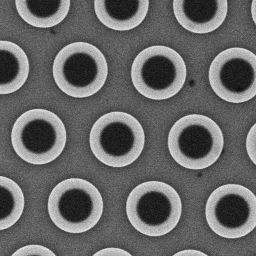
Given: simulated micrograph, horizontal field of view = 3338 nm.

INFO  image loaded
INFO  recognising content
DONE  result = an array of small figures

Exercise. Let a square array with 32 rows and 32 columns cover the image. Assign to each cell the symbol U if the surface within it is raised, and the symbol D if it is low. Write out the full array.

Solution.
DDUUUUUUUDDDUUUUUUUDDDUUUUUUDDDD
DDUUUUUUDDDDUUUUUUDDDDUUUUUUDDDU
DDDUUUUUDDDDDUUUUUDDDDUUUUUUDDDD
DDDDDDDDDDDDDDUUUDDDDDDUUUUDDDDD
DDDDDDDDDDDDDDDDDDDDDDDDDDDDDDDD
UUDDDDDDDUUDDDDDDDDDDDDDDDDDDDDD
UUUDDDDUUUUUUDDDDDUUUUDDDDDDUUUD
UUUDDDDUUUUUUDDDDUUUUUUDDDDUUUUU
UUUUDDDUUUUUUDDDUUUUUUUDDDUUUUUU
UUUDDDDUUUUUUDDDUUUUUUUDDDUUUUUU
UUUDDDDUUUUUUDDDDUUUUUUDDDUUUUUU
UUDDDDDDUUUUDDDDDUUUUUDDDDDUUUUU
DDDDDDDDDDDDDDDDDDDDDDDDDDDDUUUD
DDDDDDDDDDDDDDDDDDDDDDDDDDDDDDDD
DDDUUUUDDDDDDUUUDDDDDDDUUDDDDDDD
DDUUUUUUDDDDUUUUUDDDDDUUUUUDDDDD
DUUUUUUUDDDUUUUUUUDDDUUUUUUUDDDU
DUUUUUUUDDDUUUUUUUDDDUUUUUUUDDDU
DDUUUUUUDDDUUUUUUUDDDUUUUUUUDDDU
DDUUUUUDDDDDUUUUUDDDDDUUUUUDDDDU
DDDDDDDDDDDDDUUUDDDDDDUUUUDDDDDD
DDDDDDDDDDDDDDDDDDDDDDDDDDDDDDDD
UDDDDDDDUUDDDDDDDDDDDDDDDDDDDDDD
UUDDDDDUUUUUDDDDDUUUUUDDDDDUUUUD
UUUDDDUUUUUUUDDDUUUUUUDDDDUUUUUU
UUUDDDUUUUUUUDDDUUUUUUUDDDUUUUUU
UUUDDDUUUUUUUDDDUUUUUUUDDDUUUUUU
UUDDDDDUUUUUDDDDUUUUUUDDDDUUUUUU
UDDDDDDDUUUDDDDDDUUUUUDDDDUUUUUU
DDDDDDDDDDDDDDDDDDDDDDDDDDDDUUDD
DDDDDDDDDDDDDDDDDDDDDDDDDDDDDDDD
DDUUUUUDDDDDUUUUDDDDDDUUUDDDDDDD